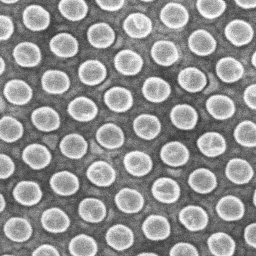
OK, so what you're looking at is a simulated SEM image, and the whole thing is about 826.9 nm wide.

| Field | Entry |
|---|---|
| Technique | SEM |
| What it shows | a regular array of raised bodies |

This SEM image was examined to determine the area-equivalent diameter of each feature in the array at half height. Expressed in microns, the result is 0.0827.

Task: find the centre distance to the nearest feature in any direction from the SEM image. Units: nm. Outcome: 122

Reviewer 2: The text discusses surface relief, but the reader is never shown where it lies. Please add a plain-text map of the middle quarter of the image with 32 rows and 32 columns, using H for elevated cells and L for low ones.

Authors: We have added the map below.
LLLLHHHHHHLLLHHHHHHLLLLLLLLLLLLL
LLLLHHHHHHLLLLHHHHHLLLLLLLLLLLHH
LLLLHHHHHHLLLLLHHHLLLLLLLLLLLHHH
HLLLHHHHHHLLLLLLLLLLLLHHLLLLLHHH
HLLLLHHHHLLLLLLLLLLLHHHHHLLLLHHH
HLLLLLLLLLLLLLLLLLLLHHHHHHLLLHHH
LLLLLLLLLLLLHHHHLLLLHHHHHHLLLLLH
LLLLLLLLLLHHHHHHLLLLHHHHHHLLLLLL
LLLLHLLLLLHHHHHHHLLLLHHHHHLLLLLL
LLHHHHHLLLHHHHHHHLLLLLLLLLLLLLLL
LHHHHHHHLLLHHHHHHLLLLLLLLLLLHHHL
LHHHHHHHLLLLHHHLLLLLLLLLLLLHHHHH
LHHHHHHHLLLLLLLLLLLLLLLLLLLHHHHH
LLLHHHHLLLLLLLLLLLHHHHHLLLLHHHHH
LLLLLLLLLLLLLLLLLLHHHHHHLLLHHHHH
LLLLLLLLLHHHHLLLLLHHHHHHLLLLHHHH
LLLLLLLLLHHHHHLLLLHHHHHHLLLLLLLL
LLLLLLLLHHHHHHHLLLHHHHHLLLLLLLLL
HHHHHLLLHHHHHHHLLLLLHHLLLLLLLLLL
HHHHHLLLLHHHHHHLLLLLLLLLLLLHLLLL
HHHHHHLLLLHHHHLLLLLLLLLLLHHHHHLL
HHHHHLLLLLLLLLLLLLLLLLLLLHHHHHHL
HHHHHLLLLLLLLLLLHHHHLLLLHHHHHHHL
LLHLLLLLLLLLLLLHHHHHHLLLHHHHHHHL
LLLLLLLLHHLLLLLHHHHHHHLLLHHHHHLL
LLLLLLLHHHHLLLLHHHHHHHLLLLLHLLLL
LLLLLLHHHHHHLLLLHHHHHHLLLLLLLLLL
HHLLLLHHHHHHHLLLLHHHLLLLLLLLLLLL
HHHLLLHHHHHHHLLLLLLLLLLLLLLLLLLH
HHHLLLLHHHHHLLLLLLLLLLLHHHHHLLLH
HHHHLLLLLLLLLLLLLLLLLLHHHHHHHLLL
HHHLLLLLLLLLLLLHHLLLLLHHHHHHHLLL